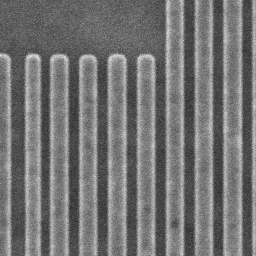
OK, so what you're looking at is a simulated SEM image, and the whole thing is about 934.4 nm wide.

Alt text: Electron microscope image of parallel lines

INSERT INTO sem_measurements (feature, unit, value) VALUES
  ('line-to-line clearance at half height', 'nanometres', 48.3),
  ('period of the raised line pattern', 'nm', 104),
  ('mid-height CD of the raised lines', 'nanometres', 58.4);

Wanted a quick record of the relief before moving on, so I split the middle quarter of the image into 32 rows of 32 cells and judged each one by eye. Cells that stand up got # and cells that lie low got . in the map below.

#...####...####....###....###...
#...####...####....###....###...
#...####...####....###....###...
#...####...####....###....###...
#...####...####....###....###...
#...####...####....###....###...
#...####...####....###....###...
#...####...####....###....###...
#...####...####....###....###...
#...####...####....###....###...
#...####...####....###....###...
#...####...####....###....###...
#...####...####....###....###...
#...####...####....###....###...
#...####...####....###....###...
#...####...####....###....###...
#...####...####....###....###...
#...####...####....###....###...
#...####...####....###....###...
#...####...####....###....###...
#...####...####....###....###...
#...####...####....###....###...
#...####...####....###....###...
#...####...####....###....###...
#...####...####....###....###...
#...####...####....###....###...
#...####...####....###....###...
#...####...####....###....###...
#...####...####....###....####..
#...####...####....###....####..
#...####...####....###....###...
#...####...####....###....####..